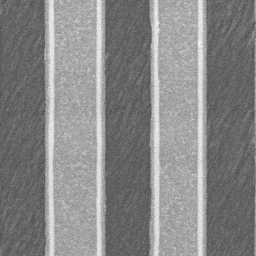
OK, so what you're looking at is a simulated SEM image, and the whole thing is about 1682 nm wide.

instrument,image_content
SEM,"one or a few lines or trenches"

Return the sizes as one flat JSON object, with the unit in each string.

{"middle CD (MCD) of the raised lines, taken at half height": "0.299 um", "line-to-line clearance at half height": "379 nm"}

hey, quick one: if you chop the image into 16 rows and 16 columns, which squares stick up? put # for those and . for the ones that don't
...###....###...
...###....###...
...###....###...
...###....###...
...###....###...
...###....###...
...###....###...
...###....###...
...###....###...
...###....###...
...###....###...
...###....###...
...###....###...
...###....###...
...###....###...
...###....###...